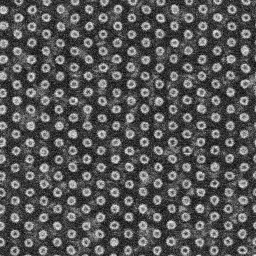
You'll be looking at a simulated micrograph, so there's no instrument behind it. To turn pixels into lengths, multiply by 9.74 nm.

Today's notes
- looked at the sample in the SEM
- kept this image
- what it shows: a regular array of raised bodies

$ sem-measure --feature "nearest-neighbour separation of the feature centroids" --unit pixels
16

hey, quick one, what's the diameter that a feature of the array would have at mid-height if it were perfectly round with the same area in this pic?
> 73.7 nanometres